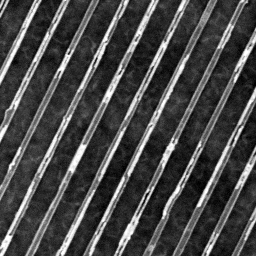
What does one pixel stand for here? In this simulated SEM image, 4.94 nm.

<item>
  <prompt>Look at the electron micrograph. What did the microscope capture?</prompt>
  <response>parallel lines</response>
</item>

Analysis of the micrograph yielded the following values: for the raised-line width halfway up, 28.8 nm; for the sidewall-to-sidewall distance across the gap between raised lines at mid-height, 105 nanometres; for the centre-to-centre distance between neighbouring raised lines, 26.4 px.